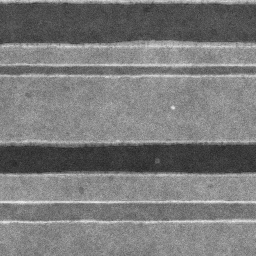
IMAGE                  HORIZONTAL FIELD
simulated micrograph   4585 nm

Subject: lines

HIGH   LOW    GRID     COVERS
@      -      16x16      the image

----------------
----------------
----------------
@@@@@@@@@@@@@@@@
@@@@@@@@@@@@@@@@
@@@@@@@@@@@@@@@@
@@@@@@@@@@@@@@@@
@@@@@@@@@@@@@@@@
@@@@@@@@@@@@@@@@
----------------
----------------
@@@@@@@@@@@@@@@@
@@@@@@@@@@@@@@@@
@@@@@@@@@@@@@@@@
@@@@@@@@@@@@@@@@
@@@@@@@@@@@@@@@@